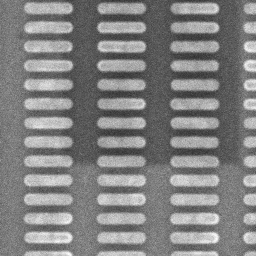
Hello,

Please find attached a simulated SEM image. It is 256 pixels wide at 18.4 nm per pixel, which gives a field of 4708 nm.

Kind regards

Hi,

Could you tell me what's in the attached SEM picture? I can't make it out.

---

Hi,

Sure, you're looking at groups of lines, slits or small figures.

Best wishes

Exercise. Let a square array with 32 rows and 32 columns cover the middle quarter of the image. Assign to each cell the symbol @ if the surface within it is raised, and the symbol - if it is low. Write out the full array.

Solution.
@@-------@@@@@@@@@@@-------@@@@@
@--------@@@@@@@@@@@-------@@@@@
--------------------------------
--------------------------------
@@-------@@@@@@@@@@@-------@@@@@
@@-------@@@@@@@@@@@-------@@@@@
--------------------------------
--------------------------------
--------------------------------
@@-------@@@@@@@@@@@-------@@@@@
@@-------@@@@@@@@@@@-------@@@@@
--------------------------------
--------------------------------
---------@@@@@------------------
@@-------@@@@@@@@@@@-------@@@@@
@@-------@@@@@@@@@@@-------@@@@@
--------------------------------
--------------------------------
@--------@@@@@@@@@@--------@@@@@
@@-------@@@@@@@@@@@-------@@@@@
@--------@@@@@@@@@@@-------@@@@@
--------------------------------
--------------------------------
@@-------@@@@@@@@@@@-------@@@@@
@@-------@@@@@@@@@@@-------@@@@@
@--------@@@@@@@@-----------@@@@
--------------------------------
--------------------------------
@@-------@@@@@@@@@@@-------@@@@@
@@-------@@@@@@@@@@@-------@@@@@
--------------------------------
--------------------------------